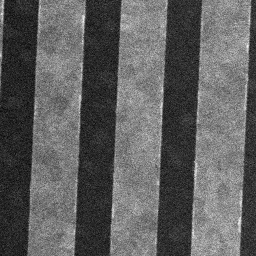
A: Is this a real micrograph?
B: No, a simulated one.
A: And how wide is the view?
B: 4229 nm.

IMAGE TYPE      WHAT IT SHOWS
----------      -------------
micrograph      one or a few lines or trenches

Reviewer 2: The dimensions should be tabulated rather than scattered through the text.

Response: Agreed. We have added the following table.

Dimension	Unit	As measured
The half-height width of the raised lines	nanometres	757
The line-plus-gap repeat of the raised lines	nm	1360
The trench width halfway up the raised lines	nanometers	586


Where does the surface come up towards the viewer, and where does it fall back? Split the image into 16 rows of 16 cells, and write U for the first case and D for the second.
DDUUUDDDUUDDDUUU
DDUUUDDDUUDDDUUU
DDUUUDDUUUDDDUUU
DDUUUDDUUUDDDUUU
DDUUUDDUUUDDUUUD
DDUUUDDUUUDDUUUD
DDUUUDDUUUDDUUUD
DDUUUDDUUUDDUUUD
DDUUUDDUUUDDUUUD
DDUUUDDUUUDDUUUD
DDUUUDDUUUDDUUUD
DDUUUDDUUUDDUUUD
DDUUUDDUUUDDUUUD
DDUUUDDUUUDDUUUD
DDUUUDDUUUDDUUUD
DDUUUDDUUUDDUUUD